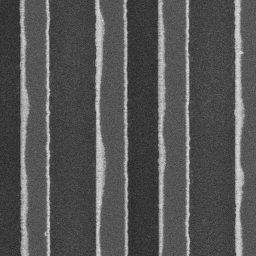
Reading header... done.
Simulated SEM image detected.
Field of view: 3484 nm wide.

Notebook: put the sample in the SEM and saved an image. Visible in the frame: lines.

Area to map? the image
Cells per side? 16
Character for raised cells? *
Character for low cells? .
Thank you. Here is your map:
.**...**..**...*
.**...**..**...*
.**...**..**...*
.**...**..**...*
.**...**..**...*
.**...**..**...*
.**...**..**...*
.**...**..**...*
.**...**..**...*
.**...**..**...*
.**...**..**...*
.**...**..**...*
.**...**..**...*
.**...**..**...*
.**...**..**...*
.**...**..**...*